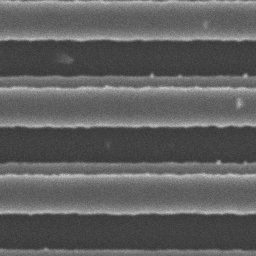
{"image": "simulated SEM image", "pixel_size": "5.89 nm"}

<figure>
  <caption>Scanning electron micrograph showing lines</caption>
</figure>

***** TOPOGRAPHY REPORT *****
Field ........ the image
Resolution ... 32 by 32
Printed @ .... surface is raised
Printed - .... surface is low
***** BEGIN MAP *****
@@@@@@@@@@@@@@@@@@@@@@@@@@@@@@@@
@@@@@@@@@@@@@@@@@@@@@@@@@@@@@@@@
@@@@@@@@@@@@@@@@@@@@@@@@@@@@@@@@
@@@@@@@@@@@@@@@@@@@@@@@@@@@@@@@@
@@@@@@@@@@@@@@@@@@@@@@@@@@@@@@@@
--------------------------------
--------------------------------
--------------------------------
--------------------------------
------------------------------@-
@@@@@@@@@@@@@@@@@@@@@@@@@@@@@@@@
@@@@@@@@@@@@@@@@@@@@@@@@@@@@@@@@
@@@@@@@@@@@@@@@@@@@@@@@@@@@@@@@@
@@@@@@@@@@@@@@@@@@@@@@@@@@@@@@@@
@@@@@@@@@@@@@@@@@@@@@@@@@@@@@@@@
@@@@@@@@@@@@@@@@@@@@@@@@@@@@@@@@
--------------------------------
--------------------------------
--------------------------------
--------------------------------
@@@@@@@@@@@@@@@@@@@@@@@@@@@@@@@@
@@@@@@@@@@@@@@@@@@@@@@@@@@@@@@@@
@@@@@@@@@@@@@@@@@@@@@@@@@@@@@@@@
@@@@@@@@@@@@@@@@@@@@@@@@@@@@@@@@
@@@@@@@@@@@@@@@@@@@@@@@@@@@@@@@@
@@@@@@@@@@@@@@@@@@@@@@@@@@@@@@@@
@@@@@@@@@@@@@@@@@@@@@@@@@@@@@@@@
--------------------------------
--------------------------------
--------------------------------
--------------------------------
@@@@@@@@@@@@@@@@@@@@@@@@@@@@@@@@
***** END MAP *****